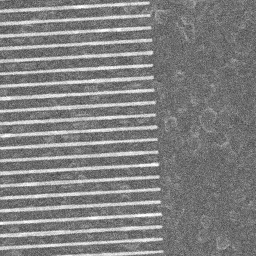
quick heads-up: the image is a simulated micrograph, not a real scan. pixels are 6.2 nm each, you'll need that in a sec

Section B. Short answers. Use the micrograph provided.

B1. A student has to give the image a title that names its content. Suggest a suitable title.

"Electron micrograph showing parallel lines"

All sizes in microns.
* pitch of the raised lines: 0.0772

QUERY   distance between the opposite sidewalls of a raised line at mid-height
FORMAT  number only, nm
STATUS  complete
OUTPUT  16.2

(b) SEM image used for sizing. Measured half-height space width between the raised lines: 59.6 nanometers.